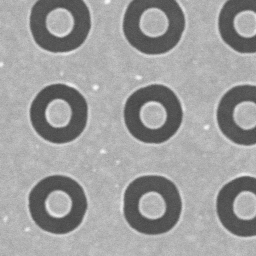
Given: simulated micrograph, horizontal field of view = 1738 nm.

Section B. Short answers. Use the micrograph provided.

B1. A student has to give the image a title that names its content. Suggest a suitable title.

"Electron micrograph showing ring-shaped grooves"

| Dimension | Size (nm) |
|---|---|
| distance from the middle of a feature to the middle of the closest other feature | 616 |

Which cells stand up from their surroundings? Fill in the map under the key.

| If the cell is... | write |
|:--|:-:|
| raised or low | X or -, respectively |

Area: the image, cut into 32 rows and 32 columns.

XXXX-------XXXXX------XXXXXX----
XXXX--XXX--XXXXX--XX---XXXXX--XX
XXXX--XXX--XXXX---XXX--XXXX--XXX
XXXX--XXX--XXXX---XXX--XXXX--XXX
XXXX---X---XXXXX--XX---XXXXX--XX
XXXXX-----XXXXXX------XXXXXX----
XXXXXX--XXXXXXXXXX---XXXXXXXXX--
XXXXXXXXXXXXXXXXXXXXXXXXXXXXXXXX
XXXXXXXXXXXXXXXXXXXXXXXXXXXXXXXX
XXXXXXXXXXXXXXXXXXXXXXXXXXXXXXXX
XXXXXXX-XXXXXXXXXXXXXXXXXXXXXXXX
XXXXX-----XXXXXXX-----XXXXXX----
XXXX-------XXXXX------XXXXXX----
XXXX--XXX--XXXXX--XX---XXXX---XX
XXXX--XXX--XXXX---XXX--XXXX--XXX
XXXX--XX---XXXXX--XX---XXXX---XX
XXXXX-----XXXXXX------XXXXXX----
XXXXXX---XXXXXXXX----XXXXXXXX---
XXXXXXXXXXXXXXXXXXXXXXXXXXXXXXXX
XXXXXXXXXXXXXXXXXXXXXXXXXXXXXXXX
XXXXXXXXXXXXXXXXXXXXXXXXXXXXXXXX
XXXXXXXXXXXXXXXXXXXXXXXXXXXXXXXX
XXXXX----XXXXXXXX----XXXXXXXX---
XXXX------XXXXXX------XXXXXX----
XXXX--XXX--XXXX---XX---XXXX---XX
XXXX--XXX--XXXX--XXXX--XXXX--XXX
XXXX--XXX--XXXX---XX---XXXX--XXX
XXXX------XXXXXX------XXXXX-----
XXXXX----XXXXXXXX-----XXXXXX----
XXXXXXXXXXXXXXXXXXXXXXXXXXXXXX--
XXXXXXXXXXXXXXXXXXXXXXXXXXXXXXXX
XXXXXXXXXXXXXXXXXXXXXXXXXXXXXXXX